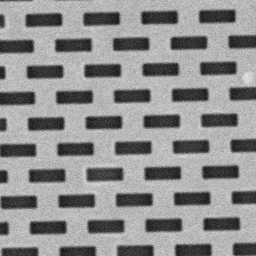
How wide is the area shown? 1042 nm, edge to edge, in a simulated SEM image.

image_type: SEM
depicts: groups of lines, slits or small figures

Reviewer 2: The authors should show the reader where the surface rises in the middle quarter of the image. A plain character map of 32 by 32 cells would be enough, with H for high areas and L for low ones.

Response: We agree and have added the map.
HHHHHLLLLLLLLLHHHHHLLLLLLLLLLHHH
HHHHHLLLLLLLLLHHHHHLLLLLLLLLLHHH
HHHHHLLLLLLLLLHHHHHLLLLLLLLLLHHH
HHHHHLHHHHHHHHHHHHHHHHHHHHHHHHHH
HHHHHHHHHHHHHHHHHHHHHHHHHHHHHHHH
HHHHHHHHHHHHHHHHHHHHHHHHHHHHHHHH
HHHHHHHHHHHHHLLLLLLLLHHHHHHLLLLL
LLLLLLLHHHHHLLLLLLLLLLHHHHHLLLLL
LLLLLLLHHHHHLLLLLLLLLLHHHHHLLLLL
LLLLLLLHHHHHHLLLLLLLLHHHHHHLLLHH
HHHHHHHHHHHHHHHHHHHHHHHHHHHHHHHH
HHHHHHHHHHHHHHHHHHHHHHHHHHHHHHHH
HHHHHHHHHHHHHHHHHHHHHHHHHLLLLHHH
HHHHHLLLLLLLLLLHHHHHLLLLLLLLLHHH
HHHHHLLLLLLLLLLHHHHHLLLLLLLLLHHH
HHHHHLLLLLLLLLLHHHHHLLLLLLLLLHHH
HHHHHHHHHHHHHHHHHHHHHHHHHHHHHHHH
HHHHHHHHHHHHHHHHHHHHHHHHHHHHHHHH
HHHHHHHHHHHHHHHHHHHHHHHHHHHHHHHH
HHHHHHHHHHHHHLLLLLLLLLHHHHHLLLLL
LLLLLLLLHHHHLLLLLLLLLLHHHHHLLLLL
LLLLLLLLHHHHLLLLLLLLLLHHHHHLLLLL
LLLLLLLHHHHHLLLLLLLLLHHHHHHHLLLL
HHHHHHHHHHHHHHHHHHHHHHHHHHHHHHHH
HHHHHHHHHHHHHHHHHHHHHHHHHHHHHHHH
HHHHHHHHHHHHHHHHHHHHHHHHHHHHHHHH
HHHHHLLLLLLLLLLHHHHHLLLLLLLLLHHH
LHHHHLLLLLLLLLLHHHHHLLLLLLLLLHHH
LHHHHLLLLLLLLLLHHHHHLLLLLLLLLHHH
HHHHHHLLLLLLLHHHHHHHHHHHHHHHHHHH
HHHHHHHHHHHHHHHHHHHHHHHHHHHHHHHH
HHHHHHHHHHHHHHHHHHHHHHHHHHHHHHHH